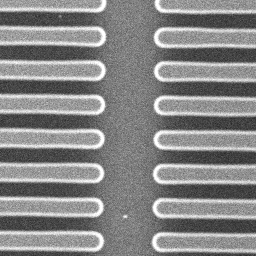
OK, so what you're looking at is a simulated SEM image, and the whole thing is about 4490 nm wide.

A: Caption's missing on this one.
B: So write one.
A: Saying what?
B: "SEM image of groups of lines, slits or small figures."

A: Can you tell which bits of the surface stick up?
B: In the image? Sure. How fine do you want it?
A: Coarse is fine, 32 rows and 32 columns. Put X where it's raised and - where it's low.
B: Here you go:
XXXXXXXXXXXXX-------XXXXXXXXXXXX
----------------------XXXXXXXXXX
--------------------------------
XXXXXXXXXXXX--------------------
XXXXXXXXXXXXX------XXXXXXXXXXXXX
------XXXXXX--------XXXXXXXXXXXX
--------------------------------
--------------------------------
XXXXXXXXXXXXX-------XXXXXXXXXXXX
XXXXXXXXXXXXX-------XXXXXXXXXXXX
--------------------------------
--------------------------------
XXXXXXXXXXXXX-------XXXXXXXXXXXX
XXXXXXXXXXXXX-------XXXXXXXXXXXX
--------------------------------
--------------------------------
XXXXXXXXXXXX--------XXXXXXXXXXX-
XXXXXXXXXXXXX------XXXXXXXXXXXXX
--------------------XXXXXXXXXXXX
--------------------------------
X-------------------------------
XXXXXXXXXXXXX------XXXXXXXXXXXXX
XXXXXXXXXXXX--------XXXXXXXXXXXX
--------------------------------
--------------------------------
XXXXXXXXXXXXX------XXXXXXXXXXXXX
XXXXXXXXXXXX-------XXXXXXXXXXXXX
--------------------------------
--------------------------------
XXXXXXXXXXXX--------XXXXXXXXXXXX
XXXXXXXXXXXXX------XXXXXXXXXXXXX
--------------------------------